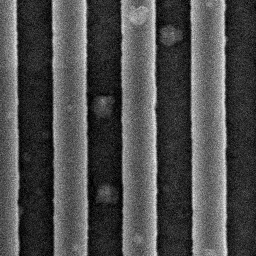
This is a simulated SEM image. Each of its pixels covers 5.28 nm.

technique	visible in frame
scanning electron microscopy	lines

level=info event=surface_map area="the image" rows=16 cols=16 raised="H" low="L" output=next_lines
HLLHHLLLHHLLHHLL
HLLHHLLLHHLLHHLL
HLLHHLLLHHLLHHLL
HLLHHLLLHHLLHHLL
HLLHHLLLHHLLHHLL
HLLHHLLLHHLLHHLL
HLLHHLLLHHLLHHLL
HLLHHLLLHHLLHHLL
HLLHHLLLHHLLHHLL
HLLHHLLLHHLLHHLL
HLLHHLLLHHLLHHLL
HLLHHLLLHHLLHHLL
HLLHHLLLHHLLHHLL
HLLHHLLLHHLLHHLL
HLLHHLLLHHLLHHLL
HLLHHLLLHHLLHHLL